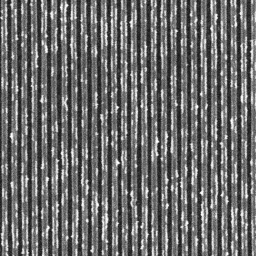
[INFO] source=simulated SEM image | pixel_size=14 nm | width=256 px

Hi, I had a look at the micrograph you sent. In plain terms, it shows parallel lines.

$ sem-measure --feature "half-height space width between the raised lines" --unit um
0.0666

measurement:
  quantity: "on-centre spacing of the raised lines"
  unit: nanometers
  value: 140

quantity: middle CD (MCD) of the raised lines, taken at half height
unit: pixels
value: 5.37